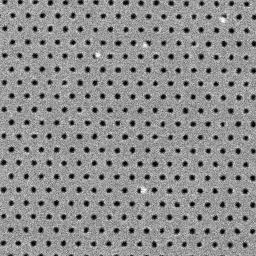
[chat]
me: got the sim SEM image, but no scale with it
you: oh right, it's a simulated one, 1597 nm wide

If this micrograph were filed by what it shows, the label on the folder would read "a regular array of holes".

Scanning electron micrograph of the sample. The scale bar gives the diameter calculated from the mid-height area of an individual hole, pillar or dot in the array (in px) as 5.87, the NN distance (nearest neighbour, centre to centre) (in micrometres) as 0.0926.